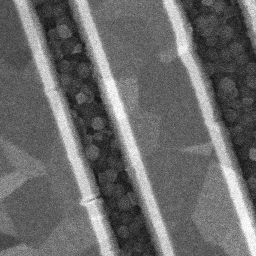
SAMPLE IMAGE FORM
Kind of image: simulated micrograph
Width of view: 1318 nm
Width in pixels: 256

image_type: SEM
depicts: one or a few lines or trenches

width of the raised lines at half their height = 432 nanometres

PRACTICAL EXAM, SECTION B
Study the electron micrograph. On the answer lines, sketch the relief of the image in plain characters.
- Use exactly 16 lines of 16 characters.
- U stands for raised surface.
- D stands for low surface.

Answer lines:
UDDDDUUUUUUDDDDD
UUDDDDUUUUUDDDDD
UUDDDDUUUUUDDDDD
UUUDDDUUUUUUDDDD
UUUDDDDUUUUUDDDD
UUUDDDDUUUUUUDDD
UUUUDDDUUUUUUDDD
UUUUDDDDUUUUUDDD
UUUUDDDDUUUUUUDD
UUUUUDDDUUUUUUDD
UUUUUDDDDUUUUUDD
UUUUUDDDDUUUUUUD
UUUUUUDDDUUUUUUD
UUUUUUDDDDUUUUUD
UUUUUUDDDDUUUUUU
UUUUUUUDDDUUUUUU